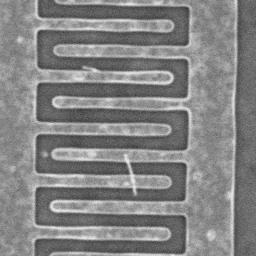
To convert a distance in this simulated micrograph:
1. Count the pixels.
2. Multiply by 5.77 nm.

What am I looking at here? groups of lines, slits or small figures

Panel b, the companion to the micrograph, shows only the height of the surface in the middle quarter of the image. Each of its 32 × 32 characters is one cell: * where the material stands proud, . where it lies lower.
...............................*
...............................*
**************************.....*
***************************....*
.....................*****.....*
...............................*
...............................*
...............................*
***............................*
********************************
********************************
...............................*
...............................*
................................
................................
**************************......
***************************....*
..............************.....*
...............................*
...............................*
...............................*
...............................*
********************************
********************************
................*.............**
...............................*
...............................*
...............................*
**************************.....*
***************************....*
..*****...****************.....*
...............................*